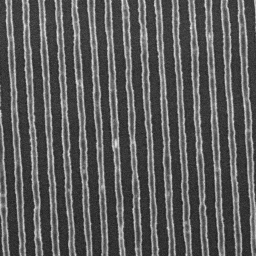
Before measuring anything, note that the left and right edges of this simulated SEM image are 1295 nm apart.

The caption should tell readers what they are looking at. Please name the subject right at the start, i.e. parallel lines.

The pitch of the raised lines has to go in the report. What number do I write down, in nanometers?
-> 83.9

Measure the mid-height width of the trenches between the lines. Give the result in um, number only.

0.0518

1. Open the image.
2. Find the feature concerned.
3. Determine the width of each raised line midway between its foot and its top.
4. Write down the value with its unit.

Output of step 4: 30.3 nm